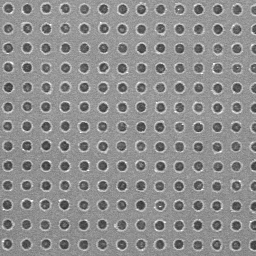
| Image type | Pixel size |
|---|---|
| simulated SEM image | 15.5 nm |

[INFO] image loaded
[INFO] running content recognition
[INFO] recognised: a regular array of holes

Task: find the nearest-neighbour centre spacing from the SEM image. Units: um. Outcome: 0.289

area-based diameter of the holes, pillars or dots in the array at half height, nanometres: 151